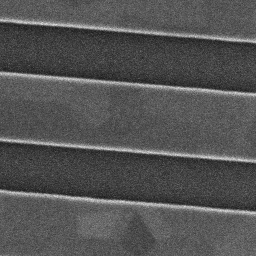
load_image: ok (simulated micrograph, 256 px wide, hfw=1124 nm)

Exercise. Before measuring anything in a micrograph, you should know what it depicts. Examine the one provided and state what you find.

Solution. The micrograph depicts one or a few lines or trenches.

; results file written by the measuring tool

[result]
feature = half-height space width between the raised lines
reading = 220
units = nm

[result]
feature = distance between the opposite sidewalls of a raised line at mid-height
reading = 300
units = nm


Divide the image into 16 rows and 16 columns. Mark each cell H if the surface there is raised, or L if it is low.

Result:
HHHHHHHHHHHHHHHH
LLHHHHHHHHHHHHHH
LLLLLLLLLLLLLLHH
LLLLLLLLLLLLLLLL
LLLLLLLLLLLLLLLL
HHHHHHHHHHHHLLLL
HHHHHHHHHHHHHHHH
HHHHHHHHHHHHHHHH
HHHHHHHHHHHHHHHH
LLLLLLLLHHHHHHHH
LLLLLLLLLLLLLLLL
LLLLLLLLLLLLLLLL
HHHHHHLLLLLLLLLL
HHHHHHHHHHHHHHHH
HHHHHHHHHHHHHHHH
HHHHHHHHHHHHHHHH